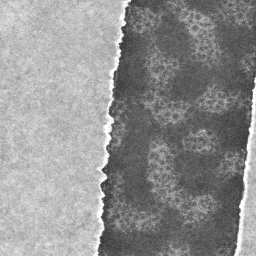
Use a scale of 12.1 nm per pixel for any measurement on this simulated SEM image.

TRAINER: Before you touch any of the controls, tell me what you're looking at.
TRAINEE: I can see one or a few lines or trenches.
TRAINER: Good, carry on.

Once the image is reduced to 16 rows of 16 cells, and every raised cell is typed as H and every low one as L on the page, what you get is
HHHHHHHHLLLLLLLL
HHHHHHHHLLLLLLLL
HHHHHHHLLLLLLLLL
HHHHHHHLLLLLLLLL
HHHHHHHLLLLLLLLL
HHHHHHHLLLLLLLLL
HHHHHHHLLLLLLLLL
HHHHHHHLLLLLLLLL
HHHHHHHLLLLLLLLL
HHHHHHHLLLLLLLLL
HHHHHHLLLLLLLLLH
HHHHHHLLLLLLLLLH
HHHHHHLLLLLLLLLH
HHHHHHLLLLLLLLLH
HHHHHHLLLLLLLLLH
HHHHHHLLLLLLLLLH